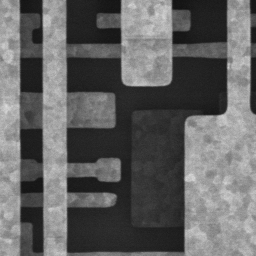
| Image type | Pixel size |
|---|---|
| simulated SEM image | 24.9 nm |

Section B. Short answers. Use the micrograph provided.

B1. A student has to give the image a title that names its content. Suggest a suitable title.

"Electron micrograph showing wiring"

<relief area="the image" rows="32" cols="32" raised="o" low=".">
oo...ooo.......oooooo.......ooo.
oo...ooo.......oooooo.......ooo.
oo...ooo.......oooooo.......ooo.
oo...ooo.......oooooo.......ooo.
oo...ooo.......oooooo.......ooo.
oo...ooo.......oooooo.......ooo.
oo...ooo.......oooooo.......ooo.
oo...ooo.......oooooo.......ooo.
oo...ooo.......oooooo.......ooo.
oo...ooo.......oooooo.......ooo.
oo...ooo........ooooo.......ooo.
oo...ooo....................ooo.
oo...ooo....................ooo.
oo...ooo....................ooo.
oo...ooo................oooooooo
oo...ooo...............ooooooooo
oo...ooo...............ooooooooo
oo...ooo...............ooooooooo
oo...ooo...............ooooooooo
oo...ooo...............ooooooooo
oo...ooo...............ooooooooo
oo....oo...............ooooooooo
oo....oo...............ooooooooo
oo....oo...............ooooooooo
oo....oo...............ooooooooo
oo....oo...............ooooooooo
oo....oo...............ooooooooo
oo....oo...............ooooooooo
oo....oo...............ooooooooo
oo....oo...............ooooooooo
oo....oo...............ooooooooo
oo....oo...............ooooooooo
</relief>